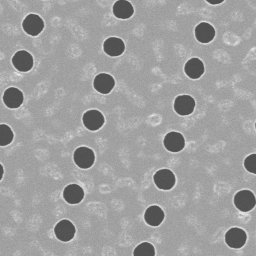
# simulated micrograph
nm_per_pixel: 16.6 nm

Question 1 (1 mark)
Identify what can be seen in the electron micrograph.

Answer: a regular array of holes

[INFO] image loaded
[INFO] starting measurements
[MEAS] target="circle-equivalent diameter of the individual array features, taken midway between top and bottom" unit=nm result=357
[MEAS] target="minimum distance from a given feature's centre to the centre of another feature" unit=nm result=628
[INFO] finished